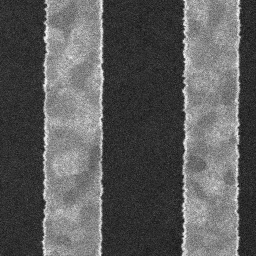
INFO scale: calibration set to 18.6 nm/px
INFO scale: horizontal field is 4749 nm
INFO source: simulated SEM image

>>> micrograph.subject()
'one or a few lines or trenches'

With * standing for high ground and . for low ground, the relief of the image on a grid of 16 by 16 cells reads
...***......***.
...***......***.
...***......***.
...***......***.
...***......***.
...***......***.
...***......***.
...***......***.
...***......***.
...***......***.
...***......***.
...***......***.
...***......***.
...***......***.
...***......***.
...***.....****.